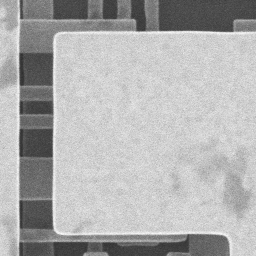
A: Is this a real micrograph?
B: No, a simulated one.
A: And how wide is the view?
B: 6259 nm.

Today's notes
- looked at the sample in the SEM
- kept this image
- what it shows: wiring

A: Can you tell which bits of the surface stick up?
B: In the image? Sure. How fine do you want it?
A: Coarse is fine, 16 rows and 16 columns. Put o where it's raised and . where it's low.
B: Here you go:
o...............
o...............
o..ooooooooooooo
o..ooooooooooooo
o..ooooooooooooo
o..ooooooooooooo
o..ooooooooooooo
o..ooooooooooooo
o..ooooooooooooo
o..ooooooooooooo
o..ooooooooooooo
o..ooooooooooooo
o..ooooooooooooo
o..ooooooooooooo
o...oooooooooooo
o.............oo